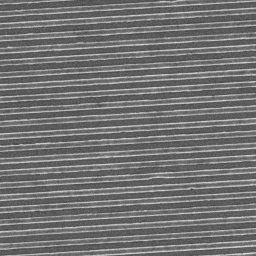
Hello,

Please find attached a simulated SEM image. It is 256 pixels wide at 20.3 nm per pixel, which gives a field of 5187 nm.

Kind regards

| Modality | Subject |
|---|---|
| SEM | parallel lines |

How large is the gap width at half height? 136 nm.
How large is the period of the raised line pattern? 0.248 micrometres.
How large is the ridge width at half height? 98.6 nm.